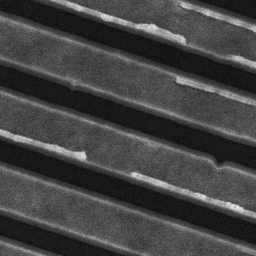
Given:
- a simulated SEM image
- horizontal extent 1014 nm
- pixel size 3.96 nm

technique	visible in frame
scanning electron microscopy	one or a few lines or trenches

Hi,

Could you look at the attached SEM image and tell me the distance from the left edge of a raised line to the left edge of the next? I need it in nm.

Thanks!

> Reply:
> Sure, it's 282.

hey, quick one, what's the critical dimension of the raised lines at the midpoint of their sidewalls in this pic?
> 0.174 µm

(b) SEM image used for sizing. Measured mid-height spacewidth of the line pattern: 0.109 um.